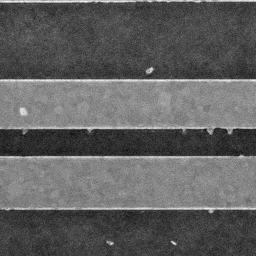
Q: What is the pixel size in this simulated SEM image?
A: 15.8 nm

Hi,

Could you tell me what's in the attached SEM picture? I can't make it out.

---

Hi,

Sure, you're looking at lines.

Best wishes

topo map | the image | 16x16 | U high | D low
DDDDDDDDDDDDDDDD
DDDDDDDDDDDDDDDD
DDDDDDDDDDDDDDDD
DDDDDDDDDDDDDDDD
DDDDDDDDDDDDDDDD
UUUUUUUUUUUUUUUU
UUUUUUUUUUUUUUUU
UUUUUUUUUUUUUUUU
DDDDDDDDDDDDDDDD
DDDDDDDDDDDDDDDD
UUUUUUUUUUUUUUUU
UUUUUUUUUUUUUUUU
UUUUUUUUUUUUUUUU
DDDDDDDDDDDDDDDD
DDDDDDDDDDDDDDDD
DDDDDDDDDDDDDDDD